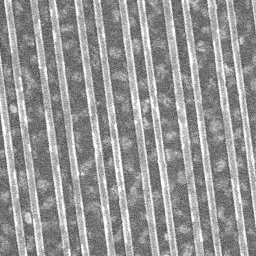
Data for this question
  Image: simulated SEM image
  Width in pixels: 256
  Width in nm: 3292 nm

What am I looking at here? parallel lines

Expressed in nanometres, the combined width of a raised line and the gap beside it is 282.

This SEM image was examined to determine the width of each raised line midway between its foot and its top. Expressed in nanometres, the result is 81.3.